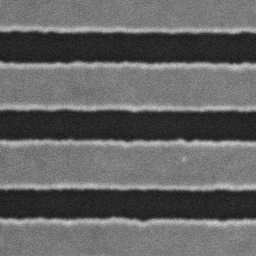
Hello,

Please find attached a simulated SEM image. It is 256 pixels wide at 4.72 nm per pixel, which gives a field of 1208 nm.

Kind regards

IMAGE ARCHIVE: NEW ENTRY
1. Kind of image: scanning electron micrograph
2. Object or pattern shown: lines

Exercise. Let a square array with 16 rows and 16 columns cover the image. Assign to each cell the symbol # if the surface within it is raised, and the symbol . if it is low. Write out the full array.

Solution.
################
################
................
................
################
################
################
................
................
################
################
################
................
................
################
################